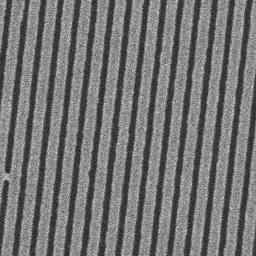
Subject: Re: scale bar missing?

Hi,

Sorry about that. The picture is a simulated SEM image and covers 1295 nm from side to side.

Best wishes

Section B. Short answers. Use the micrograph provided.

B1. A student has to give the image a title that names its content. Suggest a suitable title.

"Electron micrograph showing parallel lines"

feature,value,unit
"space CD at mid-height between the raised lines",31.4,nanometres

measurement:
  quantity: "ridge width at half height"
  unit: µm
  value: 0.0534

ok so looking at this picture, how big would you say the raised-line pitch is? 0.0862 µm